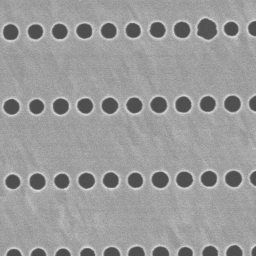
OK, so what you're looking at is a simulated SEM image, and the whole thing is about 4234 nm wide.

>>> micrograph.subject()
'a regular array of holes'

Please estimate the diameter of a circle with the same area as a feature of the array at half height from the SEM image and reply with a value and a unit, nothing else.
268 nm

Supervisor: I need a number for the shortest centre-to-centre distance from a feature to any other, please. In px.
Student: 24.4